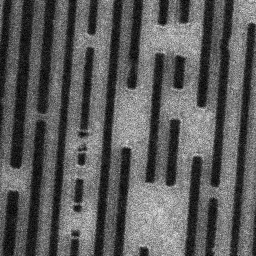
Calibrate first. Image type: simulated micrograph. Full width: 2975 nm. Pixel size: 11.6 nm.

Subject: parallel lines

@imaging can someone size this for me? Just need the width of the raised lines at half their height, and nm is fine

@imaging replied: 133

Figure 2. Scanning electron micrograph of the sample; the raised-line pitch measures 260 nm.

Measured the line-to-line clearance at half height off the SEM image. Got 123 nm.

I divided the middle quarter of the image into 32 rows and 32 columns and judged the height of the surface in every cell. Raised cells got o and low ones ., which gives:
oo...oo....ooo..ooo...ooo...oo..
oo...oo....ooo..ooo...ooo..ooo..
oo...oo....oo...ooo...ooo..ooo..
oo...oo....oo...oo....ooo..ooo..
oo...oo....oo..ooo....ooo..ooo..
oo...oo....oo..ooo....ooo..ooo..
oo...oo...ooo....o....ooo...oo..
oo..ooo...ooo.........ooo.......
oo..ooo...ooo.........oo........
o...ooo...ooo.........oo........
o...ooo...ooo.........oo........
o...ooo...ooo.........oo........
o...ooo...ooo........ooo........
o...oo....ooo........ooo...o....
o...oo....ooo........ooo..ooo...
o...oo....oo.........ooo..ooo...
o...oo....oo.........ooo..ooo...
o.........oo.........ooo..ooo...
o.........oo.........ooo..ooo...
o........ooo.........ooo..ooo...
o........ooo...o.....ooo..ooo...
.........ooo..ooo....oo...ooo...
...ooo...ooo..ooo....oo...ooo...
...ooo...ooo..ooo....oo...ooo...
...ooo...ooo..ooo....oo...oo....
....o....ooo..ooo...ooo...oo....
.........ooo..ooo...ooo..ooo....
.........oo...ooo...ooo..ooo....
...oo....oo...oo....ooo..ooo...o
...oo....oo...oo....ooo..ooo...o
...oo....oo...oo.........ooo...o
...oo...ooo...oo...............o